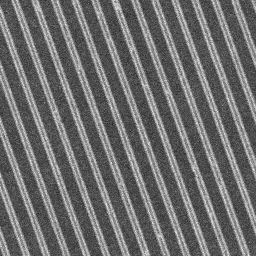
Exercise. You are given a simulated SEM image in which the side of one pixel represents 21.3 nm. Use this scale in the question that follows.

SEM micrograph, parallel lines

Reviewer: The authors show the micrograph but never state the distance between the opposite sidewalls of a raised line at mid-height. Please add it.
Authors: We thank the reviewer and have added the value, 113 nm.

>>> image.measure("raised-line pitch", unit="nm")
401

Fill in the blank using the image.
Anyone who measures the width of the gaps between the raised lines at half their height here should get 0.289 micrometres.